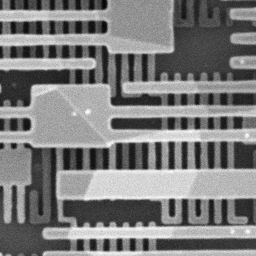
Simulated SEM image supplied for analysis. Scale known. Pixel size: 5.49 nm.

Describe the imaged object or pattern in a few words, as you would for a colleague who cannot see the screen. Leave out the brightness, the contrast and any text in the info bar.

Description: wiring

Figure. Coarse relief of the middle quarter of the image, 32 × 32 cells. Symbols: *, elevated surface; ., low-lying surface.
********........................
................................
................................
................................
..........................******
***********....*****************
***********....*****************
***********.....................
***********.....................
************....................
************....................
********************************
********************************
************....................
************....................
************....................
*************...................
********************************
********************************
*************...................
***********.....................
................................
................................
................................
................................
................................
................................
********************************
********************************
********************************
********************************
********************************